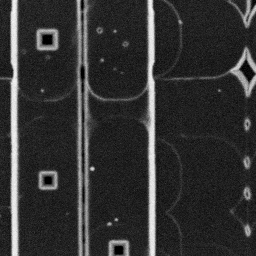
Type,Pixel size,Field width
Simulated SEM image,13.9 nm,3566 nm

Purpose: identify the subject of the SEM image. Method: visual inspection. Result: wiring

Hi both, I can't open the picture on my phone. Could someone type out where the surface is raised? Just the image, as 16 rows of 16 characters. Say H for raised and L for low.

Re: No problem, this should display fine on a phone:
LHHHHHHHHLLLLLLL
LHHHHHHHHLLLLLLL
LHHHHHHHHLLLLLLL
LHHHHHHHHLLLLLLL
LHHHHHHHHLLLLLLL
LHHHHHHHHLLLLLLL
LHHHHHHHHLLLLLLL
LHHHHHHHHLLLLLLL
LHHHHHHHHLLLLLLL
LHHHHHHHHHLLLLLL
LHHHHHHHHHLLLLLL
LHHHHHHHHHLLLLLL
LHHHHHHHHHLLLLLL
LHHHHHHHHHLLLLLL
LHHHHHHHHHLLLLLL
LHHHHHHLHHLLLLLL